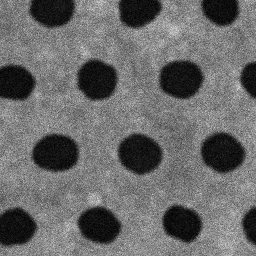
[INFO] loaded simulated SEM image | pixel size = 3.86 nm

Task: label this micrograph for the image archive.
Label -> holes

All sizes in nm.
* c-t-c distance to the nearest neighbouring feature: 317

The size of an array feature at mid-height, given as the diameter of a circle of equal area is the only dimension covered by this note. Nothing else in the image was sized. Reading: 162 nm